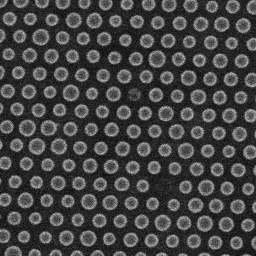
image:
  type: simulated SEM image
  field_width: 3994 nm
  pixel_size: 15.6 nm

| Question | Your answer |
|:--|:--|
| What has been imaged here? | a regular array of raised bodies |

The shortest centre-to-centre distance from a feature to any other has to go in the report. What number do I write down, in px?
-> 20.6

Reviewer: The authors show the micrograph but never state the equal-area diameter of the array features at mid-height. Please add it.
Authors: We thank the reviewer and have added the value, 12.9 px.